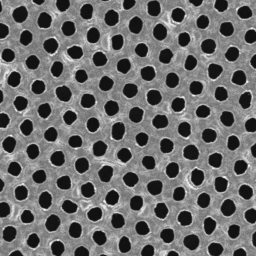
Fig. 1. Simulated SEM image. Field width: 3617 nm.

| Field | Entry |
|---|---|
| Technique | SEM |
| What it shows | a regular array of holes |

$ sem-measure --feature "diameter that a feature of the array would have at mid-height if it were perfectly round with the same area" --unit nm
204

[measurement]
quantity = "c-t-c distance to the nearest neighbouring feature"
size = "24.4 px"